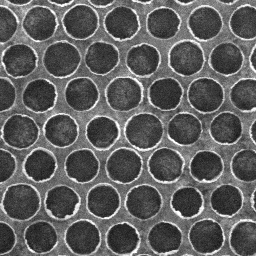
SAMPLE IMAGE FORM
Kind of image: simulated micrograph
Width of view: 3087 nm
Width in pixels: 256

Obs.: a regular array of holes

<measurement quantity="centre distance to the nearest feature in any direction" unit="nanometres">484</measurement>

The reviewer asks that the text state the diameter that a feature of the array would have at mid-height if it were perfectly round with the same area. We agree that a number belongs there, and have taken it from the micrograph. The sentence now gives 397 nanometers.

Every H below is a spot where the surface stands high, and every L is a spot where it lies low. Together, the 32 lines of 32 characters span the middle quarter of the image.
LLLHHHLLLLLLLHHHLLLLLLLHHHHLLLLL
LLLHHHHLLLLLHHHHHLLLLLLHHHHLLLLL
LLHHHHHHHLHHHHHHHHLLLLHHHHHHHLLL
HHHHLHHHHHHHHHLLHHHHHHHHHLLHHHHH
HHLLLLLHHHHHLLLLLLHHHHHLLLLLHHHH
HLLLLLLLHHHLLLLLLLLHHHLLLLLLLHHL
LLLLLLLLHHHLLLLLLLLHHLLLLLLLLLHL
LLLLLLLLLHHLLLLLLLLHHLLLLLLLLLHL
LLLLLLLLLHHLLLLLLLLHHLLLLLLLLHHL
HLLLLLLLHHHLLLLLLLLHHHLLLLLLLHHL
HHLLLLLHHHHHLLLLLLHHHHHLLLLLHHHH
HHHLLLHHHHHHHLLLHHHHHHHHHLHHHHHH
HHHHHHHHHHHHHHHHHHHLLHHHHHHHLLLH
LLHHHHHHLLLHHHHHHLLLLLLHHHHLLLLL
LLLHHHLLLLLLLHHHLLLLLLLLHHLLLLLL
LLLHHHLLLLLLLHHHLLLLLLLLLHLLLLLL
LLLHHHLLLLLLLHHLLLLLLLLLLHLLLLLL
LLLHHHLLLLLLLHHLLLLLLLLLLHLLLLLL
LLLHHHLLLLLLLHHHLLLLLLLLHHHLLLLL
LLHHHHHLLLLLLHHHLLLLLLLLHHHHLLLL
LHHHHHHLLLLLHHHHHHLLLLLHHHHHHHHH
HHHHLLHHHHHHHLLLHHHHHHHLLLLHHHHH
HHLLLLLHHHHHLLLLLLHHHHLLLLLLLHHH
HLLLLLLLHHHLLLLLLLLHHHLLLLLLLHHH
LLLLLLLLLHHLLLLLLLLHHLLLLLLLLLHH
LLLLLLLLLHLLLLLLLLLHHLLLLLLLLLHH
LLLLLLLLLHHLLLLLLLLHHHLLLLLLLHHH
HLLLLLLLHHHLLLLLLLLHHHLLLLLLLHHH
HHHLLLLHHHHHLLLLLLHHHHHLLLLLHHHH
HHHHLHHHHHHHHHLLLHHHHHHHHHHHHHHH
HHHHHHHHLLLLHHHHHHHLLHHHHHHHHHHH
LLHHHHHLLLLLLHHHHLLLLLLHHHHHLLLL